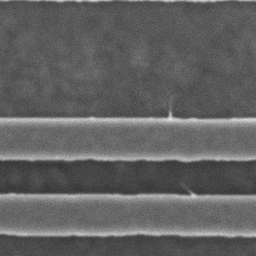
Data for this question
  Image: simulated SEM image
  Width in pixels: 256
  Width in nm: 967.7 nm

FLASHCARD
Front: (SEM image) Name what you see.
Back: lines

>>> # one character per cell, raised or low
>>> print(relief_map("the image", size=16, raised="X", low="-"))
----------------
----------------
----------------
----------------
----------------
----------------
----------------
XXXXXXXXXXXXXXXX
XXXXXXXXXXXXXXXX
XXXXXXXXXXXXXXXX
----------------
----------------
XXXXXXXXXXXXXXXX
XXXXXXXXXXXXXXXX
XXXXXXXXXXXXXXXX
----------------